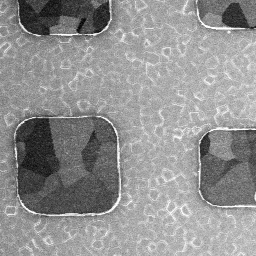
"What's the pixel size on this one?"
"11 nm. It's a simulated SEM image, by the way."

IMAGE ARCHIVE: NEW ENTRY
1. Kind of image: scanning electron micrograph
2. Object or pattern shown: raised bodies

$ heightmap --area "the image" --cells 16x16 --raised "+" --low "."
.++++++.....++++
.++++++......+++
................
................
................
................
................
..+++++.........
.++++++......+++
.++++++.....++++
.++++++.....++++
.++++++.....++++
.++++++......+++
................
................
................